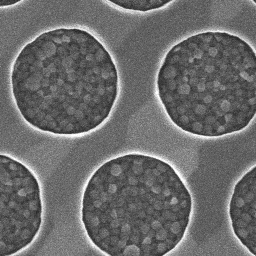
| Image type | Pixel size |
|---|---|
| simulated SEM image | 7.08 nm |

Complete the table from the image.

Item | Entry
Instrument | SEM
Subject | holes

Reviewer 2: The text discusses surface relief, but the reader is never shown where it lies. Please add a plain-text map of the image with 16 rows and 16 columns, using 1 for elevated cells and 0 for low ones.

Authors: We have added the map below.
1111111100111111
1111111111111111
1100001111110001
1000000111000000
1000000111000000
1000000111000000
1000000111000000
1100001111100000
1111111111111111
1111111111111111
0011110000011111
0011110000011110
0001100000001100
0001100000001100
0011100000001110
0111110000011110